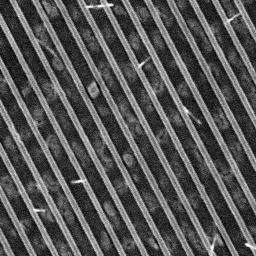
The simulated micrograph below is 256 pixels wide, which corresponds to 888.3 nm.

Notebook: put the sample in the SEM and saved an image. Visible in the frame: parallel lines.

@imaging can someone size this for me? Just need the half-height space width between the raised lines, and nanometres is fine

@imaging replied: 51.2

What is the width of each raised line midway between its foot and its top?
19.2 nanometres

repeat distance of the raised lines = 69.1 nm